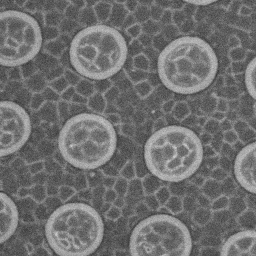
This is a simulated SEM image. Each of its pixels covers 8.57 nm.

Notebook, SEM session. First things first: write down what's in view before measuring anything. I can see raised bodies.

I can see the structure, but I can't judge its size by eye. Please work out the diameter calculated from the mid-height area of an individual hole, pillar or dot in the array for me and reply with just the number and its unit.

0.443 micrometres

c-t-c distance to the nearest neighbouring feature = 87.8 pixels